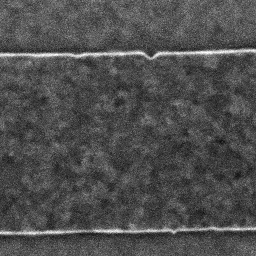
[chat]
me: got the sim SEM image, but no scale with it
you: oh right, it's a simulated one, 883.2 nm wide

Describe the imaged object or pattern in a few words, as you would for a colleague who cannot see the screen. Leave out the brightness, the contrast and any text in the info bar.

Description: one or a few lines or trenches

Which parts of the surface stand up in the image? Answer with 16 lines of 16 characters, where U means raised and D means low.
DDDDDDDDDDDDDDDD
DDDDDDDDDDDDDDDD
DDDDDDDDDDDDDDDD
UUUUUUUUUUUUUUUU
UUUUUUUUUUUUUUUU
UUUUUUUUUUUUUUUU
UUUUUUUUUUUUUUUU
UUUUUUUUUUUUUUUU
UUUUUUUUUUUUUUUU
UUUUUUUUUUUUUUUU
UUUUUUUUUUUUUUUU
UUUUUUUUUUUUUUUU
UUUUUUUUUUUUUUUU
UUUUUUUUUUUUUUUU
UUUUDDDDDDDDDDDD
DDDDDDDDDDDDDDDD